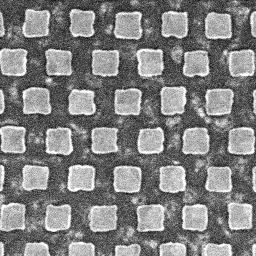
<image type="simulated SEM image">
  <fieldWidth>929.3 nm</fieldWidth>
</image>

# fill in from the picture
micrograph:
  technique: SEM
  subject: a regular array of raised bodies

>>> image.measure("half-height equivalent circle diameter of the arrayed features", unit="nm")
99.8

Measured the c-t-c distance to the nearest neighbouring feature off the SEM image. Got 0.16 µm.